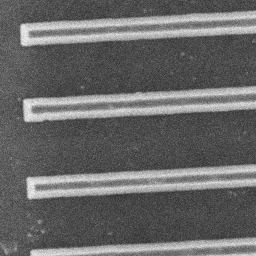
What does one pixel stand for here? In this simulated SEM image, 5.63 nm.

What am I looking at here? one or a few lines or trenches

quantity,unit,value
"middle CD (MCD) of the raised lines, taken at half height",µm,0.0928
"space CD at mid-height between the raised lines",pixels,58.8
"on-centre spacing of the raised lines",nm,431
